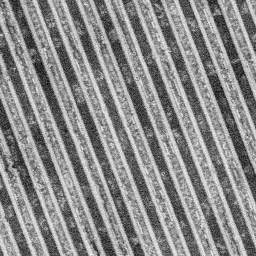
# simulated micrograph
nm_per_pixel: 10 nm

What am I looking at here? parallel lines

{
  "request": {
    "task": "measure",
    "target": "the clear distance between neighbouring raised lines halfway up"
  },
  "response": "14.1 pixels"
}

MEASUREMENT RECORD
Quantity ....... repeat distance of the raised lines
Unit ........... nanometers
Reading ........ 264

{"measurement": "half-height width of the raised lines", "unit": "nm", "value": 124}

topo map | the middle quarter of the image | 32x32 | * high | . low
...***....***....***....***....*
...***....***....***....***....*
...****....***....***....***....
....***....***....***....***....
....***....****...***.....***...
*....***....***....***....***...
*....***....***....***....***...
**...***....****....***....***..
**....***....***....***....***..
**....***....****...***....***..
***....***....***....***....***.
***....***....***....***....***.
***....***....***....****....***
.***....***....***....***....***
.***....***....***....***....***
.****...****....***....***....**
..***....***....***....***....**
..***....***....****...***....**
...***....***....***....***....*
...***....***....***....***....*
....***...***....****....***....
....***....***....***....***....
....***....***....***....***....
*...****....***....***....***...
*....***....***....***....***...
*....***....***....****...***...
**....***....***....***....***..
**....***....***....***....***..
***...****...***.....***....***.
***....***....***....***....***.
***....***....***....****...***.
****...****....***....***....***